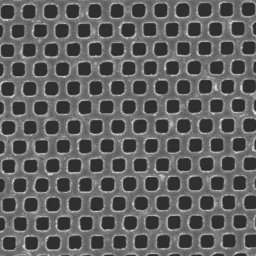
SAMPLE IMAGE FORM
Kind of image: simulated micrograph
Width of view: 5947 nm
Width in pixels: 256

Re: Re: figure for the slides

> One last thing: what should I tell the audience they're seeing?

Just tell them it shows a regular array of holes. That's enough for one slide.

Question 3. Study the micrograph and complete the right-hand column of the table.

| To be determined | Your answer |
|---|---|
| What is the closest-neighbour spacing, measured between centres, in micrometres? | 0.502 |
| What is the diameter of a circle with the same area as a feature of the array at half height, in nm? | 339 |